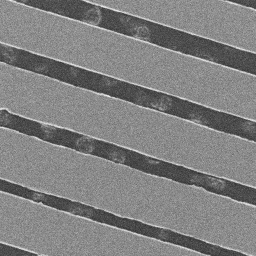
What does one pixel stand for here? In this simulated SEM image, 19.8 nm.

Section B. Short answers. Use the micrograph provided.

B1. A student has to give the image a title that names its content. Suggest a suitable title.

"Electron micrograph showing one or a few lines or trenches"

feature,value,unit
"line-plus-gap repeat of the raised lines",1260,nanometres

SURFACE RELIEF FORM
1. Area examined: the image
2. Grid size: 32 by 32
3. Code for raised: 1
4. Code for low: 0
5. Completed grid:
11100000000011111111111111111000
11111100000000011111111111111111
11111111100000000001111111111111
11111111111100000000001111111111
11111111111111110000000001111111
01111111111111111110000000001111
00001111111111111111110000000001
00000001111111111111111110000000
11000000001111111111111111111000
11111100000000111111111111111111
11111111000000000111111111111111
11111111111100000000111111111111
11111111111111100000000111111111
11111111111111111100000000111111
00011111111111111111110000000011
00000011111111111111111110000000
11000000011111111111111111110000
11111000000001111111111111111110
11111111000000001111111111111111
11111111111100000001111111111111
11111111111111100000001111111111
11111111111111111100000001111111
01111111111111111111100000010111
00001111111111111111111110000000
11000001111111111111111111110000
11111000000111111111111111111110
11111111000000111111111111111111
11111111111000000111111111111111
11111111111111100000011111111111
11111111111111111100000011111111
01111111111111111111100000011111
00001111111111111111111110000011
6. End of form